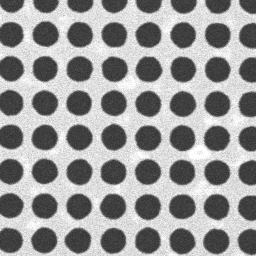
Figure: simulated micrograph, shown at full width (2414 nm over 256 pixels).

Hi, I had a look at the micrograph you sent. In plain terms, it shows a regular array of holes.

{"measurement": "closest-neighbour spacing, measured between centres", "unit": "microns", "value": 0.322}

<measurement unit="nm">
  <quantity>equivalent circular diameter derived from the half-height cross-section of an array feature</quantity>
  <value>247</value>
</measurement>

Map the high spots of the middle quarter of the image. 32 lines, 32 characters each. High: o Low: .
o......oo.......oo......ooo.....
.......oo.......oo.......oo.....
o......ooo......oo......ooo.....
o.....oooo.....oooo.....ooo.....
ooo.oooooooo.ooooooo..ooooooo..o
oooooooooooooooooooooooooooooooo
ooo.oooooooo.ooooooooooooooooooo
o.....oooo.....oooo....ooooo....
o......oo......ooo......ooo.....
.......oo.......oo......ooo.....
.......oo.......oo......oo......
o......ooo.....ooo......ooo.....
oo....ooooo...ooooo....oooo.....
oooooooooooooooooooooooooooooooo
oooooooooooooooooooooooooooooooo
oo...oooooo...oooooo..oooooo...o
o.....oooo.....ooo......ooo.....
o......oo.......oo......oo......
.......oo.......oo......oo......
o......ooo......oo......oo......
o.....oooo.....ooo......ooo.....
ooo..oooooo..ooooooo..oooooo...o
oooooooooooooooooooooooooooooooo
oooooooooooooooooooooooooooooooo
oo....oooo....ooooo....ooooo....
o......oo......ooo......ooo.....
o......oo.......oo......oo......
o......oo.......oo......oo......
o......oo......ooo......oo......
oo....oooo.....oooo....oooo.....
oooooooooooooooooooooooooooooooo
oooooooooooooooooooooooooooooooo